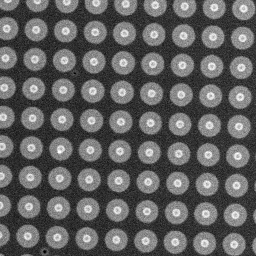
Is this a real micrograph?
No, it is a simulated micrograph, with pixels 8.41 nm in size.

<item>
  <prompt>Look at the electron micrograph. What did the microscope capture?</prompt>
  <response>an array of small figures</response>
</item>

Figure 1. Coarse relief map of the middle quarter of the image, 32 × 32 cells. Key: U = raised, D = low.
UUUDDUUUUUDDUUUUUUDUUUUUUDDUUUUU
UUDDDUUUUDDDDUUUUDDDUUUUUDDUUUUU
DDDDDDDDDDDDDDUUDDDDDUUDDDDDUUUD
DDDDDDDDDDDDDDDDDDDDDDDDDDDDDDDD
UUDDDUUUUDDDDUUUDDDDDDDDDDDDDDDD
UUDDDUUUUUDDUUUUUDDDUUUUDDDDUUUD
UUUDUUUUUUDDUUUUUDDUUUUUUDDUUUUU
UUDDUUUUUUDDUUUUUDDUUUUUUDDUUUUU
UUDDDUUUUDDDUUUUUDDUUUUUUDDUUUUU
DDDDDDUUDDDDDUUUDDDDUUUUDDDUUUUD
DDDDDDDDDDDDDDDDDDDDDDDDDDDDDDDD
UDDDDDUUDDDDDDDDDDDDDDDDDDDDDDDD
UUDDDUUUUDDDUUUUDDDDUUUDDDDDUUDD
UUDDUUUUUUDDUUUUUDDUUUUUDDDUUUUD
UUDDUUUUUUDUUUUUUDDUUUUUDDUUUUUU
UUDDUUUUUDDDUUUUUDDUUUUUDDUUUUUU
UDDDDUUUUDDDUUUUDDDUUUUUDDDUUUUD
DDDDDDDDDDDDDDDDDDDDDDDDDDDDUUDD
DDDDDDDDDDDDDDDDDDDDDDDDDDDDDDDD
UDDDDUUUUDDDUUUDDDDDUUDDDDDDDDDD
UUDDUUUUUDDDUUUUDDDUUUUUDDDUUUUD
UUDDUUUUUDDUUUUUUDDUUUUUDDUUUUUD
UUDDUUUUUDDUUUUUUDDUUUUUDDUUUUUD
UDDDDUUUUDDDUUUUDDDUUUUUDDUUUUUD
DDDDDDDDDDDDDUUDDDDDUUUDDDDUUUUD
DDDDDDDDDDDDDDDDDDDDDDDDDDDDDDDD
UDDDDUUUDDDDDDDDDDDDDDDDDDDDDDDD
UUDDUUUUUDDUUUUUDDDUUUUDDDDUUUDD
UUDDUUUUUDDUUUUUDDUUUUUUDDUUUUUD
UUDUUUUUUDDUUUUUDDUUUUUUDDUUUUUD
UDDDUUUUUDDUUUUUDDUUUUUUDDUUUUUD
DDDDDUUDDDDDUUUDDDDUUUUDDDUUUUUD